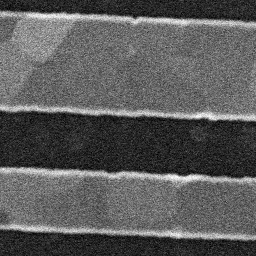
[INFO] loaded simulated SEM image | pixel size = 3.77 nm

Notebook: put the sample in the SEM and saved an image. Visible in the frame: one or a few lines or trenches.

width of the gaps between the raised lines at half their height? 233 nm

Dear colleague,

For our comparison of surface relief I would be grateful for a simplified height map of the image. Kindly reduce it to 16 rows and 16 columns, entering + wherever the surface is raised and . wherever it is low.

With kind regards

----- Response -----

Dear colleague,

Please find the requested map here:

................
+++++++++++++++.
++++++++++++++++
++++++++++++++++
++++++++++++++++
++++++++++++++++
++++++++++++++++
................
................
................
................
++++++++++++++++
++++++++++++++++
++++++++++++++++
........++++++++
................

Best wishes